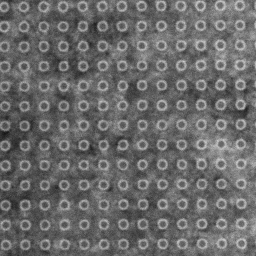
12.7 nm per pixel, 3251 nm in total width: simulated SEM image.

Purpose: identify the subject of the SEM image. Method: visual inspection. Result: a regular array of raised bodies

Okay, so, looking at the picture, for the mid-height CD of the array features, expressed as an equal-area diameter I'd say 0.112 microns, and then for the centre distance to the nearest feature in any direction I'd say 248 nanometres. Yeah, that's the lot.